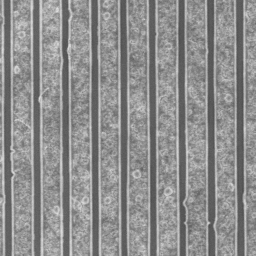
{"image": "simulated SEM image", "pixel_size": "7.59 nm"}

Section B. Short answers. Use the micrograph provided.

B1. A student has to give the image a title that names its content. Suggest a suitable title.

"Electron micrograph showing parallel lines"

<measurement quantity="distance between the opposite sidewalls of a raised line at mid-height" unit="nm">163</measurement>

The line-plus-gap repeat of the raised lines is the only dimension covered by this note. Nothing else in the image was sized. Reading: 220 nm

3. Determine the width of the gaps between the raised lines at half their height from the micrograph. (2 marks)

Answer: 63.6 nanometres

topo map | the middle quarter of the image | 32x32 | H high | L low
LHHHHHHLLHHHHHLLHHHHHLLHHHHHLLHH
LHHHHHHLLHHHHHLLHHHHHLLHHHHHLLHH
LHHHHHHLLHHHHHLLHHHHHLLHHHHHLLHH
LHHHHHHLLHHHHHLLHHHHHLLHHHHHLLHH
LHHHHHHLLHHHHHLLHHHHHLLHHHHHLLHH
LHHHHHHLLHHHHHLLHHHHHLLHHHHHLLHH
LHHHHHHLLHHHHHLLHHHHHLLHHHHHLLHH
LHHHHHHLLHHHHHLLHHHHHLLHHHHHLLHH
LHHHHHHLLHHHHHLLHHHHHLLHHHHHLLHH
LHHHHHHLLHHHHHLLHHHHHLLHHHHHLLHH
LHHHHHHLLHHHHHLLHHHHHLLHHHHHLLHH
LLHHHHHLLHHHHHLLHHHHHLLHHHHHLLHH
LLHHHHHLLHHHHHLLHHHHHLLHHHHHLLHH
LLHHHHHLLHHHHHLLHHHHHLLHHHHHLLHH
LLHHHHHLLHHHHHLLHHHHHLLHHHHHLLHH
LLHHHHHLLHHHHHLLHHHHHLLHHHHHLLHH
LLHHHHHLLHHHHHLLHHHHHLLHHHHHLLLH
LLHHHHHLLHHHHHLLHHHHHLLHHHHHLLLH
LLHHHHHLLHHHHHLLHHHHHLLHHHHHLLLH
LLHHHHHLLHHHHHLLHHHHHLLHHHHHLLLH
LLHHHHHLLHHHHHLLHHHHHLLHHHHHLLLH
LLHHHHHLLHHHHHLLHHHHHLLHHHHHLLLH
LLHHHHHLLHHHHHLLHHHHHLLHHHHHLLLH
LLHHHHHLLHHHHHLLHHHHHLLHHHHHLLLH
LLHHHHHLLHHHHHLLHHHHHLLHHHHHLLLH
LLHHHHHLLHHHHHLLHHHHHLLHHHHHLLLH
LLHHHHHLLHHHHHLLHHHHHLLHHHHHLLLH
LLHHHHHLLHHHHHLLHHHHHLLHHHHHLLLH
LLHHHHHLLHHHHHLLHHHHHLLHHHHHLLLH
LLHHHHHLLHHHHHLLHHHHHLLHHHHHLLLH
LLHHHHHLLHHHHHLLHHHHHLLHHHHHLLLH
LLHHHHHLLHHHHHLLHHHHHLLHHHHHLLLH